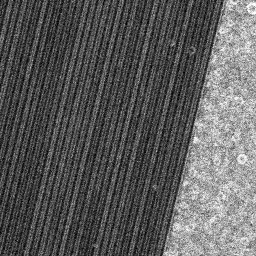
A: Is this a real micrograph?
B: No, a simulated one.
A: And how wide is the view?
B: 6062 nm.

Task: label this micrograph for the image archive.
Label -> parallel lines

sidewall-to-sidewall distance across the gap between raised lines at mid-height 0.0518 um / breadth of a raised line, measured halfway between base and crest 4.5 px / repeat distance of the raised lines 160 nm